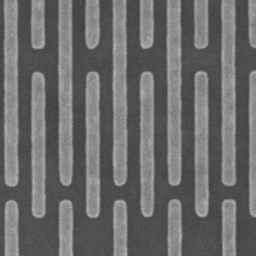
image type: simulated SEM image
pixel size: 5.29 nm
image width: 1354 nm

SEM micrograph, wiring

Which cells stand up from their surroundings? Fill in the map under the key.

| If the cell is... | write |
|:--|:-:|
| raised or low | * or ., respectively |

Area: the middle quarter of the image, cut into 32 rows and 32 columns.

**...........**...........***...
**...........**...........***...
**....**.....**.....**....***...
**....**.....**....***....***...
**....**.....**....***....***...
**....**.....**....***....***...
**....**.....**....***....***...
**....**.....**....***....***...
**....**.....**....***....***...
**....**.....**....***....***...
**....**.....**....***....***...
**....**.....**....***....***...
**....**.....**....***....***...
**....***....**....***....***...
**....***....**....***....***...
**....***....**....***....***...
**....***....**....***....***...
**....***....**....***....***...
**....***....**....***....***...
**....***....**....***....***...
**....***....**....***....***...
**....***....**....***....***...
**....***....**....***....***...
**....***....**....***....***...
**....***....**....***....***...
**....***....**....***....***...
**....**.....**....***....***...
**....***....**....***....***...
**....***....**....***....***...
**....***....**....***.....**...
......***..........***..........
......***..........***..........